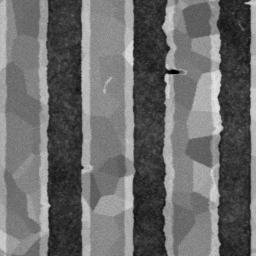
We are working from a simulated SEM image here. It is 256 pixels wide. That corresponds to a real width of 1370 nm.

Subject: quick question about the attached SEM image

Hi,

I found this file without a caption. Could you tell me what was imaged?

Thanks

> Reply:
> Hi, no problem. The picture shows one or a few lines or trenches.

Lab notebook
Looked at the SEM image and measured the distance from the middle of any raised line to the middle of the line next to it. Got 0.452 micrometres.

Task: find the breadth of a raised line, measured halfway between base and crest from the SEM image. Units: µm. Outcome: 0.243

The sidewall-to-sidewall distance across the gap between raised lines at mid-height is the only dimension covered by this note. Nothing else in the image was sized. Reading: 209 nm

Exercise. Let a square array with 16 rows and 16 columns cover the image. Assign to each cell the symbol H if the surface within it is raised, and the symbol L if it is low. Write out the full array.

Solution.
HHHLLHHHLLLHHHLL
HHHLLHHHLLHHHHLL
HHHLLHHHLLLHHHLL
HHHLLHHHLLLHHLLL
HHHLLHHHLLLHHHLL
HHHLLHHHLLLHHHLL
HHHLLHHHLLHHHHLL
HHHLLHHHLLLHHHLL
HHHLLHHHLLHHHHLL
HHHLLHHHLLHHHHLL
HHHLLHHHLLLHHHLL
HHHLLHHHLLLHHLLL
HHHLLHHHLLHHHLLL
HHHLLHHHLLHHHLLL
HHHLLHHHLLHHHLLL
HHHLLHHHLLHHHLLL